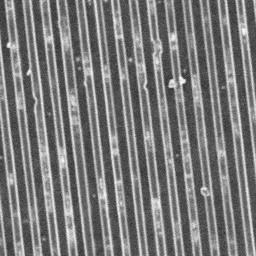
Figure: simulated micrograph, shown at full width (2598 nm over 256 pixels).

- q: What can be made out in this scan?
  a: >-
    parallel lines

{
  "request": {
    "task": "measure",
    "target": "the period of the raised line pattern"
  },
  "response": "179 nanometres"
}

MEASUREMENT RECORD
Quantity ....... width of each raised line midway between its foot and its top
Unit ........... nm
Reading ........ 79.4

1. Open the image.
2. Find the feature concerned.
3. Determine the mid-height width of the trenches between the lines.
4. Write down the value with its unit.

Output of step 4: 0.0995 micrometres